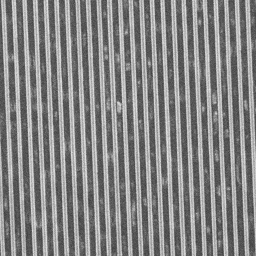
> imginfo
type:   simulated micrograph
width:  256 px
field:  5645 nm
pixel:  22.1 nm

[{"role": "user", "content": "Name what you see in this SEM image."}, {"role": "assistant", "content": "parallel lines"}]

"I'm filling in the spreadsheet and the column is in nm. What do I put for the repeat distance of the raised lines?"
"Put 234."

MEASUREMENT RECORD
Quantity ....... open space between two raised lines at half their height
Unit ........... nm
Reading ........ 165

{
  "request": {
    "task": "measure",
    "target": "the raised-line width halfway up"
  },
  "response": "0.0688 micrometres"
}